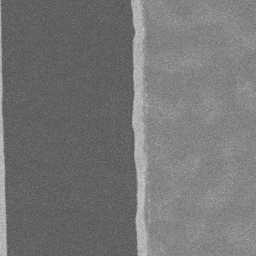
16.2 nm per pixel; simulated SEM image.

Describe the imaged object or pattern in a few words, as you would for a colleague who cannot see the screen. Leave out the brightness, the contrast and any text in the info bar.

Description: one or a few lines or trenches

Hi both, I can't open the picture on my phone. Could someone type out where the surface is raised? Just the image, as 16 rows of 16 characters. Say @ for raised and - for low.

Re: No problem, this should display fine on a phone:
---------@@@@@@@
---------@@@@@@@
---------@@@@@@@
---------@@@@@@@
---------@@@@@@@
---------@@@@@@@
---------@@@@@@@
---------@@@@@@@
---------@@@@@@@
---------@@@@@@@
---------@@@@@@@
---------@@@@@@@
---------@@@@@@@
---------@@@@@@@
---------@@@@@@@
---------@@@@@@@